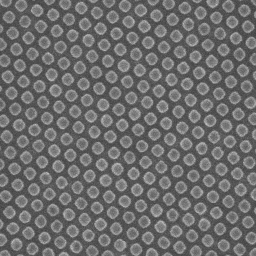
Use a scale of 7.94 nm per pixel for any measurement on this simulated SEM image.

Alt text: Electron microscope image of a regular array of raised bodies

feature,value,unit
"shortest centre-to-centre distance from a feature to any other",129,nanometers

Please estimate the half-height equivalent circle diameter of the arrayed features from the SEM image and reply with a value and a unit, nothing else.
90 nm